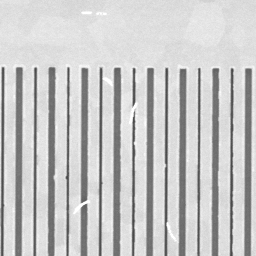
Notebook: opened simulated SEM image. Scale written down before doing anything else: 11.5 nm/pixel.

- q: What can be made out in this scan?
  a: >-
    parallel lines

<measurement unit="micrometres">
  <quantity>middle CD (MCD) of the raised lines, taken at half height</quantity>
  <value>0.128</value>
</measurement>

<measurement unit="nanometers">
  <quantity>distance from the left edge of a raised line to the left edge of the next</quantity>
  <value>188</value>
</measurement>